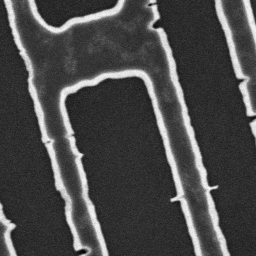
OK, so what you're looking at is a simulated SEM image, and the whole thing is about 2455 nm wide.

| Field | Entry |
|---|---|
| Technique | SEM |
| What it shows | one or a few lines or trenches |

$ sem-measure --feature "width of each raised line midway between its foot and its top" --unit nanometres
257